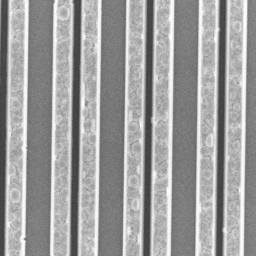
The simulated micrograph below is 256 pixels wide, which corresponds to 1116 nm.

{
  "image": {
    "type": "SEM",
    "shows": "parallel lines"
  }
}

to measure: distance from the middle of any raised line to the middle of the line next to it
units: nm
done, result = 159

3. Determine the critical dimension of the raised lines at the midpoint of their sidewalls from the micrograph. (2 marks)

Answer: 80.6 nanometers